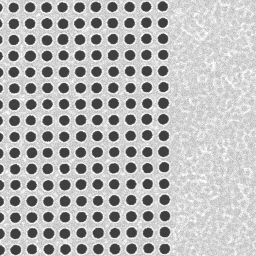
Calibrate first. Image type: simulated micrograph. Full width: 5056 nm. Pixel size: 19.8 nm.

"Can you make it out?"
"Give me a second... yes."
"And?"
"a regular array of holes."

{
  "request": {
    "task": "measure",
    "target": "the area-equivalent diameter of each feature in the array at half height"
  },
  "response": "0.217 µm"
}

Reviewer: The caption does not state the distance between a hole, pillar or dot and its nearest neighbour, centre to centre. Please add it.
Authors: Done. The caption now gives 15.9 px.